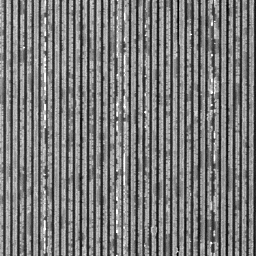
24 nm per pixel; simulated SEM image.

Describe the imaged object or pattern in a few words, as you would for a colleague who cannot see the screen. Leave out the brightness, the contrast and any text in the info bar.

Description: parallel lines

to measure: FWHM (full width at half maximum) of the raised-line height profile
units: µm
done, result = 0.0869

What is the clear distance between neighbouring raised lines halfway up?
65.9 nm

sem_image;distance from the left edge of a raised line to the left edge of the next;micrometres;0.167